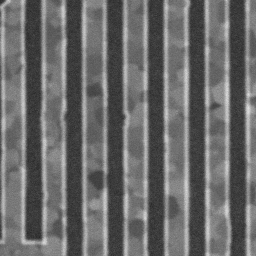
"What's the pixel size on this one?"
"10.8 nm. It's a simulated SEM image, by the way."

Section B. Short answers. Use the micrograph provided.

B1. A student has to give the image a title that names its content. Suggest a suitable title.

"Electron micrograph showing parallel lines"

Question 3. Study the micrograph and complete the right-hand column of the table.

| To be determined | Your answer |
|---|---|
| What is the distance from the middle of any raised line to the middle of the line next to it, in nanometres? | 441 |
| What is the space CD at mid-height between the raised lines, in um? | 0.227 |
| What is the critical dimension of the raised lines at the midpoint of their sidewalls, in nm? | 216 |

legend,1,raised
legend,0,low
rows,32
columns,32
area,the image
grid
01100011000110001100011000110001
11100011000110001100011000110001
11100011000110001100011000110001
11100011000110001100011000110001
11100011000110001100011000110001
11100011000110001100011000110001
11100011000110001100011000110001
11100011000110001100011000110001
11100011000110001100011000110001
11100011000110001100011000110001
11100011000110001100011000110001
11100011000110001100011000110001
11100011000110001100011000110001
11100111000110001100011000110001
11100111000110001100011000110001
11100111000110001100011000110001
11100011000110001100011000110001
11100011000110001100011000110001
11100011000110001100011000110001
11100011000110001100011000110001
11100011000110001100011000110001
11100011000110001100011000110001
11100011000110001100011000110001
11100011000110001100011000110001
11100011000110001100011000110001
11100011000110001100011000110001
11100011000110001100011000110001
11100011000110001100011000110001
11100011000110001100011000111001
11100011000110001100011000111001
11111111000110001100011000111001
11111111000110001100011000110001